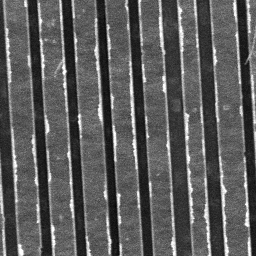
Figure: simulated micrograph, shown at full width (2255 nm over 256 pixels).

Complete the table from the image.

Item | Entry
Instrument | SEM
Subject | parallel lines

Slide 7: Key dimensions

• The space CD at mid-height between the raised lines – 94.5 nanometers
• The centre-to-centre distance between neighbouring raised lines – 0.305 µm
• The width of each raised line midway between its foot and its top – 204 nm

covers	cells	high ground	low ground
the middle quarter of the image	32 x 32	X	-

---XXXXXX--XXXXXX---XXXXX----XXX
---XXXXXX--XXXXXX---XXXXX-----XX
---XXXXXX--XXXXXX---XXXXX-----XX
---XXXXXX---XXXXX---XXXXX-----XX
---XXXXXX---XXXXX---XXXXX-----XX
---XXXXXX---XXXXX---XXXXX-----XX
---XXXXXX---XXXXX---XXXXX-----XX
X--XXXXXX---XXXXX---XXXXX-----XX
X---XXXXX---XXXXX---XXXXX-----XX
X---XXXXX---XXXXX---XXXXXX----XX
X---XXXXX---XXXXX---XXXXXX----XX
X---XXXXXX--XXXXX---XXXXXX----XX
X---XXXXXX--XXXXX---XXXXXX----XX
X---XXXXXX--XXXXX---XXXXXX----XX
X---XXXXXX--XXXXXX--XXXXXX----XX
X---XXXXXX--XXXXXX---XXXXX----XX
X---XXXXXX--XXXXXX---XXXXX----XX
X---XXXXXX--XXXXXX---XXXXX----XX
X---XXXXXX--XXXXXX---XXXXX-----X
X---XXXXXX--XXXXXX---XXXXX-----X
X---XXXXXX---XXXXX---XXXXX-----X
X---XXXXXX---XXXXX---XXXXX-----X
X---XXXXXX---XXXXX---XXXXX-----X
XX--XXXXXX---XXXXX---XXXXX-----X
XX--XXXXXX---XXXXX---XXXXX-----X
XX---XXXXX---XXXXX---XXXXXX----X
XX---XXXXX---XXXXX---XXXXXX----X
XX---XXXXX---XXXXX---XXXXXX----X
XX---XXXXXX--XXXXX---XXXXXX----X
XX---XXXXXX--XXXXX---XXXXXX----X
XX---XXXXXX--XXXXXX--XXXXXX----X
XX---XXXXXX--XXXXXX--XXXXXX----X